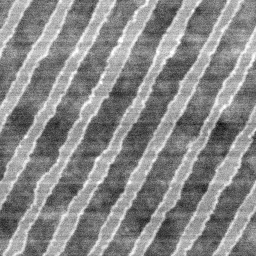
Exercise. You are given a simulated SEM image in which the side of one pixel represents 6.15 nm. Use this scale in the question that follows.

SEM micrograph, parallel lines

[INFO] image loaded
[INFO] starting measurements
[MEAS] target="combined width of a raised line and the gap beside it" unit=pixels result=37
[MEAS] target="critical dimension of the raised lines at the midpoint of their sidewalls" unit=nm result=155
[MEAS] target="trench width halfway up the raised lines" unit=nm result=71.7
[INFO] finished